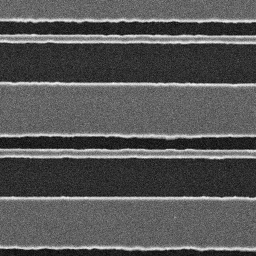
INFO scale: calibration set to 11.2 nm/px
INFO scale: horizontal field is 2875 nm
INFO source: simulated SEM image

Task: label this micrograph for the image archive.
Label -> lines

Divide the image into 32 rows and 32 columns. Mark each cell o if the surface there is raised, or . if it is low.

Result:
oooooooooooooooooooooooooooooooo
oooooooooooooooooooooooooooooooo
oooooooooooooooooooooooooooooooo
oooooooooooooooooooooooooooooooo
oooooooooooooooooooooooooooooooo
................................
................................
................................
................................
................................
oooooooooo..o.oooo..............
oooooooooooooooooooooooooooooooo
oooooooooooooooooooooooooooooooo
oooooooooooooooooooooooooooooooo
oooooooooooooooooooooooooooooooo
oooooooooooooooooooooooooooooooo
oooooooooooooooooooooooooooooooo
oooooooooooooooooooooooooooooooo
oooooooooooooooooooooooooooooooo
oooooooooooooooooooooooooooooooo
................................
................................
................................
................................
................................
oooooooooooooooooooooooooooooooo
oooooooooooooooooooooooooooooooo
oooooooooooooooooooooooooooooooo
oooooooooooooooooooooooooooooooo
oooooooooooooooooooooooooooooooo
oooooooooooooooooooooooooooooooo
oooooooooooooooooooooooooooooooo